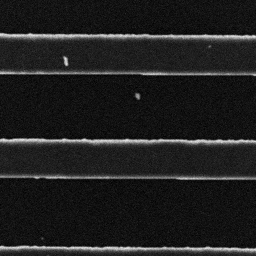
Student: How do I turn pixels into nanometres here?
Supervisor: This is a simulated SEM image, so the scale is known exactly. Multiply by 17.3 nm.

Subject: lines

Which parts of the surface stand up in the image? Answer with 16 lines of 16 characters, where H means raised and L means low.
LLLLLLLLLLLLLLLL
LLLLLLLLLLLLLLLL
HHHHHHHHHHHHHHHH
HHHHHHHHHHHHHHHH
HHHHHHHHHHHHHHHH
LLLLLLLLLLLLLLLL
LLLLLLLLLLLLLLLL
LLLLLLLLLLLLLLLL
LLLLLLLLLLLLLLLL
HHHHHHHHHHHHHHHH
HHHHHHHHHHHHHHHH
LLLLLLLLLLLLLLLL
LLLLLLLLLLLLLLLL
LLLLLLLLLLLLLLLL
LLLLLLLLLLLLLLLL
HHHHHHHHHLLLLHLL